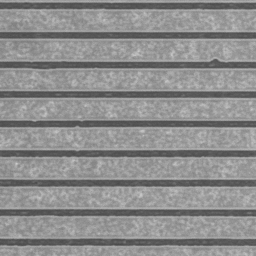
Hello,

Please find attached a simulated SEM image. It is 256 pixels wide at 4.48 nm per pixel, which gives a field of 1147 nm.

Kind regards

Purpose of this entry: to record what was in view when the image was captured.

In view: parallel lines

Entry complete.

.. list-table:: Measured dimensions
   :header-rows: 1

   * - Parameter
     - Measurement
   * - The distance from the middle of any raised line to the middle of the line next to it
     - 132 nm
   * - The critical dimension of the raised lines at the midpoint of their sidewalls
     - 96.8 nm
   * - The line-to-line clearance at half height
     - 35.3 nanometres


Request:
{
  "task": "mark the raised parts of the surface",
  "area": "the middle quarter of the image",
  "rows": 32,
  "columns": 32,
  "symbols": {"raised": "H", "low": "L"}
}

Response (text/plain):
LLLLLLLLLLLLLLLLLLLLLLLLLLLLLLLL
HHHHHHHHHHHHHHHHHHHHHHHHHHHHHHHH
HHHHHHHHHHHHHHHHHHHHHHHHHHHHHHHH
HHHHHHHHHHHHHHHHHHHHHHHHHHHHHHHH
HHHHHHHHHHHHHHHHHHHHHHHHHHHHHHHH
HHHHHHHHHHHHHHHHHHHHHHHHHHHHHHHH
LLLLLLLLLLLLLLLLLLLLLLLLLLLLLLLL
LLLLLLLLLLLLLLLLLLLLLLLLLLLLLLLL
LLLLLLLLLLLLLLLLLLLLLLLLLLLLLLLL
HHHHHHHHHHHHHHHHHHHHHHHHHHHHHHHH
HHHHHHHHHHHHHHHHHHHHHHHHHHHHHHHH
HHHHHHHHHHHHHHHHHHHHHHHHHHHHHHHH
HHHHHHHHHHHHHHHHHHHHHHHHHHHHHHHH
HHHHHHHHHHHHHHHHHHHHHHHHHHHHHHHH
LLLLLLLLLLLLLLLLLLLLLLLLLLLLLLLL
LLLLLLLLLLLLLLLLLLLLLLLLLLLLLLLL
HHHHHHHHHHHHHHHHHHHHHHHHHHHHHHHH
HHHHHHHHHHHHHHHHHHHHHHHHHHHHHHHH
HHHHHHHHHHHHHHHHHHHHHHHHHHHHHHHH
HHHHHHHHHHHHHHHHHHHHHHHHHHHHHHHH
HHHHHHHHHHHHHHHHHHHHHHHHHHHHHHHH
LLLLLLLLLLLLLLLLLLLLLLLLLLLLLLLL
LLLLLLLLLLLLLLLLLLLLLLLLLLLLLLLL
HHHHHHHHHHHHHHHHHHHHHHHHHHHHHHHH
HHHHHHHHHHHHHHHHHHHHHHHHHHHHHHHH
HHHHHHHHHHHHHHHHHHHHHHHHHHHHHHHH
HHHHHHHHHHHHHHHHHHHHHHHHHHHHHHHH
HHHHHHHHHHHHHHHHHHHHHHHHHHHHHHHH
HHHHHHHHHHHHHHHHHHHHHHHHHHHHHHHH
LLLLLLLLLLLLLLLLLLLLLLLLLLLLLLLL
LLLLLLLLLLLLLLLLLLLLLLLLLLLLLLLL
HHHHHHHHHHHHHHHHHHHHHHHHHHHHHHHH